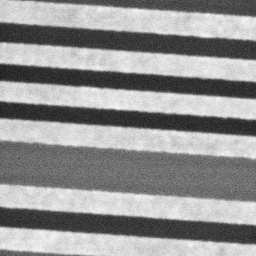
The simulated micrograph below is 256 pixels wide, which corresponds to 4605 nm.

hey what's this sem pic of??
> lines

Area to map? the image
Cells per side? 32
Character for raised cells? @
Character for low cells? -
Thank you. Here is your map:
@@@@@@@-------------------------
@@@@@@@@@@@@@@@@@@@@@@----------
@@@@@@@@@@@@@@@@@@@@@@@@@@@@@@@@
-----------@@@@@@@@@@@@@@@@@@@@@
-------------------------@@@@@@@
@-------------------------------
@@@@@@@@@@@@@@@@----------------
@@@@@@@@@@@@@@@@@@@@@@@@@@@@@@--
---------@@@@@@@@@@@@@@@@@@@@@@@
-----------------------@@@@@@@@@
@@@@@---------------------------
@@@@@@@@@@@@@@@@@@--------------
@@@@@@@@@@@@@@@@@@@@@@@@@@@@@@@@
------------@@@@@@@@@@@@@@@@@@@@
---------------------------@@@@@
@@@@@@@@@-----------------------
@@@@@@@@@@@@@@@@@@@@@@@@--------
-@@@@@@@@@@@@@@@@@@@@@@@@@@@@@@@
--------------@@@@@@@@@@@@@@@@@@
-----------------------------@@@
--------------------------------
--------------------------------
--------------------------------
@@@@@@--------------------------
@@@@@@@@@@@@@@@@@@--------------
@@@@@@@@@@@@@@@@@@@@@@@@@@@@@@@@
---------@@@@@@@@@@@@@@@@@@@@@@@
------------------------@@@@@@@@
@-------------------------------
@@@@@@@@@@@@@@@@----------------
@@@@@@@@@@@@@@@@@@@@@@@@@@@@@---
-----@@@@@@@@@@@@@@@@@@@@@@@@@@@